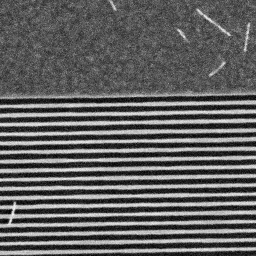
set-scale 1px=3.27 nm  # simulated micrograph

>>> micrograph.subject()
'parallel lines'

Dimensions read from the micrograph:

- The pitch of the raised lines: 9.17 pixels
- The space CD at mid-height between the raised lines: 18.8 nm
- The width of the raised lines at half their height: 9.4 nm